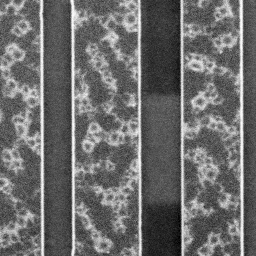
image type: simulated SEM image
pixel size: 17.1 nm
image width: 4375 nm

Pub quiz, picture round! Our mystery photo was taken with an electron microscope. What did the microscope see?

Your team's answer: one or a few lines or trenches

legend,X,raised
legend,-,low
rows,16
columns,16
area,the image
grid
XXX-XXXXX--XXXX-
XXX--XXXX--XXXX-
XXX--XXXX--XXXX-
XXX--XXXX--XXXX-
XXX--XXXX--XXXX-
XXX--XXXX--XXXX-
XXX--XXXX--XXXX-
XXX--XXXX--XXXX-
XXX--XXXX--XXXX-
XXX--XXXX--XXXX-
XXX--XXXX--XXXX-
XXX--XXXX--XXXX-
XXX--XXXX--XXXX-
XXX--XXXX--XXXX-
XXX--XXXX--XXXX-
XXX--XXXX--XXXX-